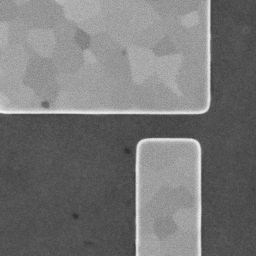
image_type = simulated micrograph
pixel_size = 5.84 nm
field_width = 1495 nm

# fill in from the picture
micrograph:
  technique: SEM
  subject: wiring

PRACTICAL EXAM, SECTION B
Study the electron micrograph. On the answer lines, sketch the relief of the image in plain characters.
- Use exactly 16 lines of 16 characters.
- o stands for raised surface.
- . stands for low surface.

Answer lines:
ooooooooooooo...
ooooooooooooo...
ooooooooooooo...
ooooooooooooo...
ooooooooooooo...
ooooooooooooo...
ooooooooooooo...
................
................
.........oooo...
.........oooo...
.........oooo...
.........oooo...
.........oooo...
.........oooo...
.........oooo...